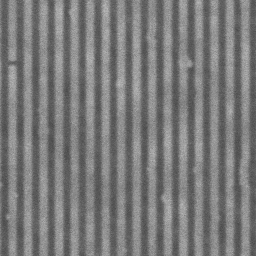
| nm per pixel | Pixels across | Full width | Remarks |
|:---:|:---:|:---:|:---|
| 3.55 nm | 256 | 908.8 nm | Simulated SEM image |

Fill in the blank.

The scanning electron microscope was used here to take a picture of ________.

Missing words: parallel lines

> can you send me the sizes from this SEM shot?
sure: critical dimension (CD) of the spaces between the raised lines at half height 28.9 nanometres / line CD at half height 28.9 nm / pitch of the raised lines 55.1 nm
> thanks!